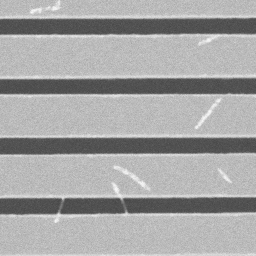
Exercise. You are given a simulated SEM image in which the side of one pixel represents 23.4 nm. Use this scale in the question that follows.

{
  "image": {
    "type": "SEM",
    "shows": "lines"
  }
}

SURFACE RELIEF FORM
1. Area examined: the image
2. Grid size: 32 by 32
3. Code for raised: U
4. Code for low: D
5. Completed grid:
UUUUUUUUUUUUUUUUUUUUUUUUUUUUUUUU
UUUUUUUUUUUUUUUUUUUUUUUUUUUUUUUU
DDDDDDDDDDDDDDDDDDDDDDDDDDDDDDDD
DDDDDDDDDDDDDDDDDDDDDDDDDDDDDDDD
UUUUUUUUUUUUUUUUUUUUUUUUUUUUUUUU
UUUUUUUUUUUUUUUUUUUUUUUUUUUUUUUU
UUUUUUUUUUUUUUUUUUUUUUUUUUUUUUUU
UUUUUUUUUUUUUUUUUUUUUUUUUUUUUUUU
UUUUUUUUUUUUUUUUUUUUUUUUUUUUUUUU
UUUUUUUUUUUUUUUUUUUUUUUUUUUUUUUU
DDDDDDDDDDDDDDDDDDDDDDDDDDDDDDDD
DDDDDDDDDDDDDDDDDDDDDDDDDDDDDDDD
UUUUUUUUUUUUUUUUUUUUUUUUUUUUUUUU
UUUUUUUUUUUUUUUUUUUUUUUUUUUUUUUU
UUUUUUUUUUUUUUUUUUUUUUUUUUUUUUUU
UUUUUUUUUUUUUUUUUUUUUUUUUUUUUUUU
UUUUUUUUUUUUUUUUUUUUUUUUUUUUUUUU
DDDDDDDDDDDDDDDDDDDDDDDDDDDDDDDD
DDDDDDDDDDDDDDDDDDDDDDDDDDDDDDDD
UUUUUUUUUUUUUUUUUUUUUUUUUUUUUUUU
UUUUUUUUUUUUUUUUUUUUUUUUUUUUUUUU
UUUUUUUUUUUUUUUUUUUUUUUUUUUUUUUU
UUUUUUUUUUUUUUUUUUUUUUUUUUUUUUUU
UUUUUUUUUUUUUUUUUUUUUUUUUUUUUUUU
UUUUUUUUUUUUUUUUUUUUUUUUUUUUUUUU
DDDDDDDDDDDDDDDDDDDDDDDDDDDDDDDD
DDDDDDDDDDDDDDDDDDDDDDDDDDDDDDDD
UUUUUUUUUUUUUUUUUUUUUUUUUUUUUUUU
UUUUUUUUUUUUUUUUUUUUUUUUUUUUUUUU
UUUUUUUUUUUUUUUUUUUUUUUUUUUUUUUU
UUUUUUUUUUUUUUUUUUUUUUUUUUUUUUUU
UUUUUUUUUUUUUUUUUUUUUUUUUUUUUUUU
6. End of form